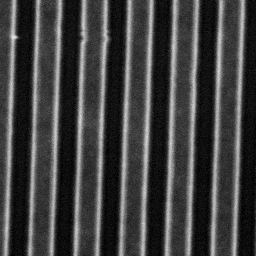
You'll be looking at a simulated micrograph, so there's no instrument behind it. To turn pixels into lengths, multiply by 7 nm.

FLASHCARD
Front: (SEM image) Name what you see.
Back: parallel lines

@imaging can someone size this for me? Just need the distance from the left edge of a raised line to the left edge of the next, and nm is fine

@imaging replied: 319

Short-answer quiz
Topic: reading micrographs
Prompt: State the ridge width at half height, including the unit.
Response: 23.1 px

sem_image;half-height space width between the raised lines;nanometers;156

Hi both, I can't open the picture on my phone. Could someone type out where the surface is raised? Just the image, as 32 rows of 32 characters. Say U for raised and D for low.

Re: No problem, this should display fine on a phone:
UUDDDUUUDDUUUDDDUUUDDDUUUDDDUUDD
UUDDDUUUDDUUUDDDUUUDDDUUUDDDUUDD
UUDDDUUDDDUUUDDDUUUDDDUUUDDDUUDD
UUDDDUUDDDUUUDDDUUUDDDUUUDDUUUDD
UUDDDUUDDDUUUDDDUUUDDDUUUDDUUUDD
UUDDDUUDDDUUUDDDUUUDDDUUUDDUUUDD
UUDDUUUDDDUUUDDDUUUDDDUUUDDUUUDD
UUDDUUUDDDUUUDDDUUUDDDUUDDDUUUDD
UUDDUUUDDDUUUDDDUUUDDDUUDDDUUUDD
UDDDUUUDDDUUUDDDUUUDDDUUDDDUUUDD
UDDDUUUDDDUUUDDDUUUDDUUUDDDUUUDD
UDDDUUUDDDUUUDDDUUUDDDUUDDDUUUDD
UDDDUUUDDDUUUDDDUUUDDDUUDDDUUUDD
UDDDUUUDDDUUUDDDUUDDDUUUDDDUUUDD
UDDDUUUDDDUUUDDDUUDDDUUUDDDUUUDD
UDDDUUUDDDUUUDDDUUDDDUUUDDDUUUDD
UDDDUUUDDDUUUDDDUUDDDUUUDDDUUUDD
UDDDUUUDDDUUUDDDUUDDDUUUDDDUUUDD
UDDDUUUDDDUUUDDDUUDDDUUUDDDUUUDD
UDDDUUUDDDUUUDDUUUDDDUUUDDDUUUDD
UDDDUUUDDDUUUDDUUUDDDUUUDDDUUUDD
UDDDUUUDDDUUUDDUUUDDDUUUDDDUUUDD
UDDDUUUDDDUUUDDUUUDDDUUUDDDUUUDD
UDDDUUUDDDUUDDDUUUDDDUUUDDDUUUDD
UDDDUUUDDDUUDDDUUUDDDUUUDDDUUUDD
UDDDUUUDDDUUDDDUUUDDDUUUDDDUUUDD
UDDDUUUDDDUUDDDUUUDDDUUUDDDUUUDD
UDDDUUUDDDUUDDDUUUDDDUUUDDDUUDDD
UDDDUUUDDDUUDDDUUUDDDUUUDDDUUDDD
UDDDUUUDDUUUDDDUUUDDDUUUDDDUUDDD
UDDDUUUDDUUUDDDUUUDDDUUUDDDUUDDD
UDDDUUUDDUUUDDDUUUDDDUUUDDDUUDDD